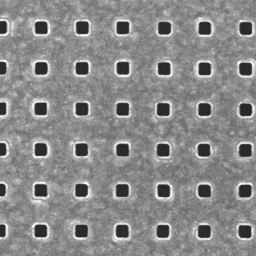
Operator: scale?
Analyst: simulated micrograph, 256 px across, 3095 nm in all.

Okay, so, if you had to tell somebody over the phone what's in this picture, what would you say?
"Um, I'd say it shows a regular array of holes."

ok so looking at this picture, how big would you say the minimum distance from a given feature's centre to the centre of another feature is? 486 nanometres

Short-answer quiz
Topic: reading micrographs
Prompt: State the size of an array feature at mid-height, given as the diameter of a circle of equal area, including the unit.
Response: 14.3 pixels